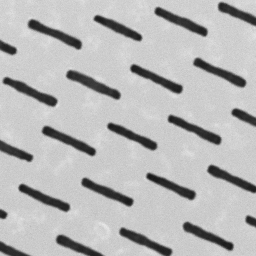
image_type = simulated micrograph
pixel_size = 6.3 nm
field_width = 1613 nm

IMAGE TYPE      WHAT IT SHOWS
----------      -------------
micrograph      a regular array of holes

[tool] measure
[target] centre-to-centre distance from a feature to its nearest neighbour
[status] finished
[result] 388 nanometres